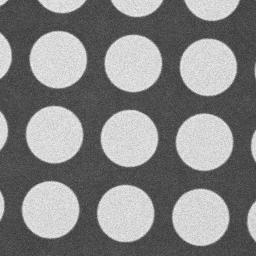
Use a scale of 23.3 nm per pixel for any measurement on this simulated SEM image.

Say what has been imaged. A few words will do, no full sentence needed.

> an array of small figures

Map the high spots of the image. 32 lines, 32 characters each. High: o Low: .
.....ooooo....oooooo...ooooooo..
.......o.......oooo.....ooooo...
..........................o.....
................................
.....oooo.......o...............
o...oooooo....ooooo.....oooo....
o...ooooooo..ooooooo...oooooo...
o...ooooooo..ooooooo...oooooo...
o...ooooooo..ooooooo...ooooooo..
....oooooo....oooooo...oooooo...
......ooo.....ooooo....oooooo...
........................oooo....
................................
......oo........................
....ooooo.....oooo......ooo.....
o...oooooo...oooooo....ooooo....
o..ooooooo...ooooooo..ooooooo...
o..ooooooo...ooooooo..ooooooo...
....oooooo...oooooo...ooooooo..o
.....oooo....oooooo....oooooo...
...............ooo.....ooooo....
................................
................................
....ooooo.....ooo...............
...oooooo....ooooo.....oooo.....
...ooooooo..ooooooo...oooooo....
...ooooooo..ooooooo...ooooooo..o
...ooooooo..ooooooo...ooooooo..o
....ooooo....oooooo...oooooo...o
.....ooo......oooo.....ooooo...o
........................oo......
................................